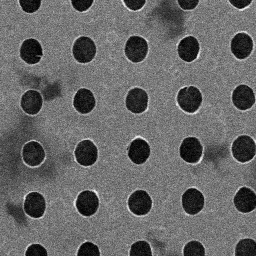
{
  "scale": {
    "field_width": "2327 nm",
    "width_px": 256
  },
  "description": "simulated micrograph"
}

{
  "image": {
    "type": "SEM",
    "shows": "a regular array of holes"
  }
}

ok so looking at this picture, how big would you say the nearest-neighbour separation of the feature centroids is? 464 nm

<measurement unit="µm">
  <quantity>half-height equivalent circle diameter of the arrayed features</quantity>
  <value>0.222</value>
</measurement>